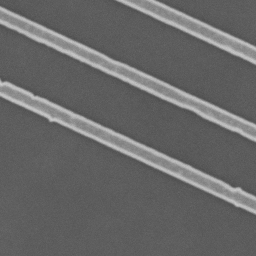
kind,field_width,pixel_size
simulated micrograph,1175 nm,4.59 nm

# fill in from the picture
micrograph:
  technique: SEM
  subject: one or a few lines or trenches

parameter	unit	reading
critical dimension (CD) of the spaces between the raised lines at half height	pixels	54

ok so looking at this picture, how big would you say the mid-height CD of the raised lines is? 0.0578 micrometres